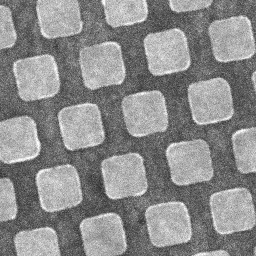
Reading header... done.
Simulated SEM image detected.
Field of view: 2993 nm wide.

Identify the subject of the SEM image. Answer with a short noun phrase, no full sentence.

a regular array of raised bodies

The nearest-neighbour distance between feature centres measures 759 nm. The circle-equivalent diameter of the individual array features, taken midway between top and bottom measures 0.536 µm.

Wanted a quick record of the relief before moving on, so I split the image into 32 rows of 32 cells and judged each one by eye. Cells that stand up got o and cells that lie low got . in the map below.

.....ooooo...ooooo...ooooo......
o....ooooo...ooooo..............
oo...ooooo...ooooo..........ooo.
oo...ooooo................ooooo.
oo....oo...........oooo...oooooo
oo...........o....ooooo....ooooo
..........ooooo...oooooo...ooooo
...oooo...ooooo...oooooo...oo...
..ooooo...ooooo....oooo.........
..ooooo...oooooo................
..ooooo....ooo..........ooooo...
..ooooo............o....ooooo...
...o...........oooooo...ooooo...
........oooo...oooooo...ooooo...
.......oooooo...ooooo...ooooo...
oooo....ooooo...ooooo...........
oooo....ooooo...ooo...........oo
ooooo...ooooo................ooo
ooooo...oo...........ooooo...ooo
oooo...........oo....ooooo...ooo
.............ooooo...ooooo....oo
.....ooooo...ooooo...oooooo...oo
o....ooooo...ooooo....oooo......
oo...ooooo...ooooo..............
oo...ooooo....oo...........oooo.
oo...ooooo..........ooo...oooooo
oo................ooooo....ooooo
o..........oooo...oooooo...ooooo
..........ooooo....ooooo...oooo.
..ooooo...oooooo...ooooo........
..ooooo...oooooo...ooo..........
..ooooo....oooo............o....